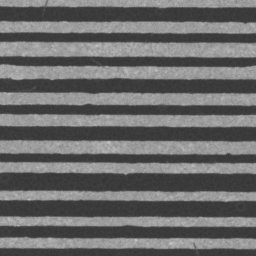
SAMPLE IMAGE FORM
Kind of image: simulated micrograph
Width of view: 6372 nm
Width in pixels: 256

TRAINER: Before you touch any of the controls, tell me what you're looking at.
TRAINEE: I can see parallel lines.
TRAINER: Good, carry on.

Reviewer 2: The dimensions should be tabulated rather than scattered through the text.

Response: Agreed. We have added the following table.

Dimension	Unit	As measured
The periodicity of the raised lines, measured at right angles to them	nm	597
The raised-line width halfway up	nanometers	264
